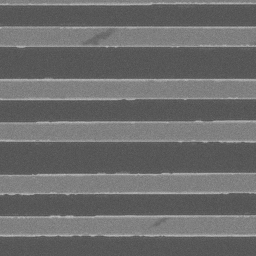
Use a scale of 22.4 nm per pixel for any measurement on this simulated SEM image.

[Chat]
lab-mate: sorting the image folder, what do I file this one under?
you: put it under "lines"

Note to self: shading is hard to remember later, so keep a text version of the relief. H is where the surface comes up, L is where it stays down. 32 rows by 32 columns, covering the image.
HHHHHHHHHHHHHHHHHLLLLLLLLLLLLLLL
LLLLLLLLLLLLLLLLLLLLLLLLLLLLLLLL
LLLLLLLLLLLLLLLLLLLLLLLLLLLLLLLL
HHHHHHHHHHHHHHHHHHHHHHHHHHHHHHHH
HHHHHHHHHHHHHHHHHHHHHHHHHHHHHHHH
HHHHHHHHHHHHHHHHHHHHHHHHHHHHHHHH
LLLLLLLLLLLLLLLLLLLLLLLLLLLLLLLL
LLLLLLLLLLLLLLLLLLLLLLLLLLLLLLLL
LLLLLLLLLLLLLLLLLLLLLLLLLLLLLLLL
LLLLLLLLLLLLLLLLLLLLLLLLLLLLLLLL
HHHHHHHHHHHHHHHHHHHHHHHHHHHHHHHH
HHHHHHHHHHHHHHHHHHHHHHHHHHHHHHHH
LLLLLLLLLLLLLLLLLLLLLLLLLLLLLLLL
LLLLLLLLLLLLLLLLLLLLLLLLLLLLLLLL
LLLLLLLLLLLLLLLLLLLLLLLLLLLLLLLL
HHHHHHHHHHHHHHHHHHHHHHHHHHHHHHHH
HHHHHHHHHHHHHHHHHHHHHHHHHHHHHHHH
HHHHHHHHHHHHHHHHHHHHHHHHHHHHHHHH
LLLLLLLLLLLLLLLLLLLLLLLLLLLLLLLL
LLLLLLLLLLLLLLLLLLLLLLLLLLLLLLLL
LLLLLLLLLLLLLLLLLLLLLLLLLLLLLLLL
LLLLLLLLLLLLLLLLLLLLLLLLLLLLLLLL
HHHHHHHHHHHHHHHHHHHHHHHHHHHHHHHH
HHHHHHHHHHHHHHHHHHHHHHHHHHHHHHHH
LLLLLLLLLLLLLLLLLLLLLLLLLLLLLLLL
LLLLLLLLLLLLLLLLLLLLLLLLLLLLLLLL
LLLLLLLLLLLLLLLLLLLLLLLLLLLLLLLL
HHHHHHHHHHHHHHHHHHHHHHHHHHHHHHHH
HHHHHHHHHHHHHHHHHHHHHHHHHHHHHHHH
LLLLLLLLLLLLLLLLLLLLLLLLLLLLLLLL
LLLLLLLLLLLLLLLLLLLLLLLLLLLLLLLL
LLLLLLLLLLLLLLLLLLLLLLLLLLLLLLLL